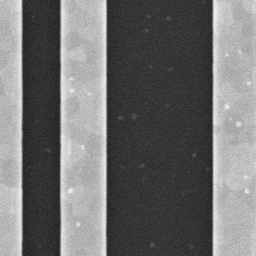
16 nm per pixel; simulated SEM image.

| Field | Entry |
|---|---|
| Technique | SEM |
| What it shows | wiring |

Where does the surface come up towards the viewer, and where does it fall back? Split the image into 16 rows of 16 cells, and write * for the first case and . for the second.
*...***......***
*...***......***
*...***......***
*...***......***
*...***......***
*...***......***
*...***......***
*...***......***
*...***......***
*...***......***
*...***......***
*...***......***
*...***......***
*...***......***
*...***......***
*...***......***